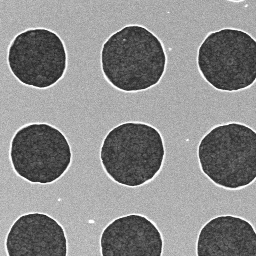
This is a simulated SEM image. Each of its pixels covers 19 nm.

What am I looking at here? holes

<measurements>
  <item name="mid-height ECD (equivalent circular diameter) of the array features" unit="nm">1170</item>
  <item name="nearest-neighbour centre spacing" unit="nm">1770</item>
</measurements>